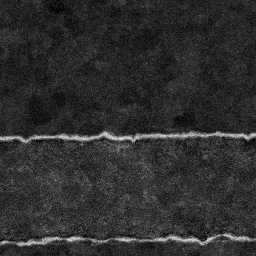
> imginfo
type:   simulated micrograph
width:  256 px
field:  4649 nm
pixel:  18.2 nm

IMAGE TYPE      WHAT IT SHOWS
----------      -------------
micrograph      one or a few lines or trenches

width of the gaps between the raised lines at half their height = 1870 nanometers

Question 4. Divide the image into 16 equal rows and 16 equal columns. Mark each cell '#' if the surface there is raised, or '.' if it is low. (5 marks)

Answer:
################
################
################
################
################
################
################
################
######.##......#
................
................
................
................
................
................
################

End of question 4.